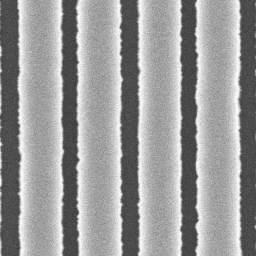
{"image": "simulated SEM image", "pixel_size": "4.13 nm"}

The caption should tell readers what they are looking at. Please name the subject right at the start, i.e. lines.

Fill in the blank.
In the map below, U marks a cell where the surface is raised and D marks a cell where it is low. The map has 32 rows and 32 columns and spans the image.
DDUUUUUUDDUUUUUDDUUUUUUDUUUUUUDD
DDUUUUUUDDUUUUUDDUUUUUUDDUUUUUDD
DDUUUUUUDDUUUUUDDUUUUUUDDUUUUUDD
DDUUUUUUDDUUUUUDDUUUUUUDDUUUUUDD
DDUUUUUUDDUUUUUDDUUUUUUDDUUUUUDD
DDUUUUUUDDUUUUUDDUUUUUUDDUUUUUDD
DDUUUUUUDDUUUUUDDUUUUUUDDUUUUUDD
DDUUUUUUDDUUUUUDDUUUUUUDDUUUUUDD
DDUUUUUUDDUUUUUDDUUUUUUDDUUUUUDD
DDUUUUUUDDUUUUUDDUUUUUUDDUUUUUDD
DDUUUUUUDDUUUUUDDUUUUUUDDUUUUUDD
DDUUUUUUDDUUUUUDDUUUUUUDDUUUUUDD
DDUUUUUUDDUUUUUDDUUUUUUDDUUUUUDD
DDUUUUUUDDUUUUUDDUUUUUUDDUUUUUDD
DDUUUUUUDDUUUUUDDUUUUUUDDUUUUUDD
DDUUUUUUDDUUUUUDDUUUUUUDDUUUUUDD
DDUUUUUUDDUUUUUDDUUUUUUDDUUUUUDD
DDUUUUUUDDUUUUUDDUUUUUUDDUUUUUDD
DDUUUUUUDDUUUUUDDUUUUUUDDUUUUUDD
DDDUUUUUDDUUUUUDDUUUUUUDDUUUUUDD
DDDUUUUUDDUUUUUDDUUUUUUDDUUUUUDD
DDDUUUUUDDUUUUUDDUUUUUUDDUUUUUDD
DDDUUUUUDDUUUUUDDUUUUUUDDUUUUUDD
DDDUUUUUDDUUUUUDDUUUUUUDDUUUUUDD
DDUUUUUUDDUUUUUDDUUUUUUDDUUUUUDD
DDDUUUUUDDUUUUUDDUUUUUUDDUUUUUDD
DDDUUUUUDDUUUUUDDUUUUUUDDUUUUUDD
DDUUUUUUDDUUUUUDDUUUUUUDDUUUUUDD
DDUUUUUUDDUUUUUDDUUUUUUDDUUUUUDD
DDUUUUUUDDUUUUUDDUUUUUUDDUUUUUDD
DDDUUUUUDDUUUUUDDUUUUUUDDUUUUUDD
DDDUUUUUDDUUUUUDDUUUUUUDDUUUUUDD